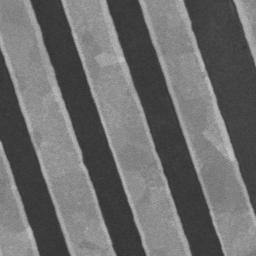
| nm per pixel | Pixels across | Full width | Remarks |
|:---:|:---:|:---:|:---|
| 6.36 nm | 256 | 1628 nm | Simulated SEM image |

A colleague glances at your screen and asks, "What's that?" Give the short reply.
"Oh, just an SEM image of lines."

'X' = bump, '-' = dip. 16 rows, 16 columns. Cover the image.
XX--XXX--XXX---X
XX--XXX--XXX---X
XXX--XX--XXX---X
XXX--XXX--XXX---
-XX--XXX--XXX---
-XXX--XX--XXX---
-XXX--XXX--XXX--
--XX--XXX--XXX--
--XXX--XX--XXX--
--XXX--XXX--XXX-
X--XX--XXX--XXX-
X--XXX--XXX--XX-
X--XXX--XXX--XXX
XX--XX--XXX--XXX
XX--XXX--XX---XX
XX--XXX--XXX--XX